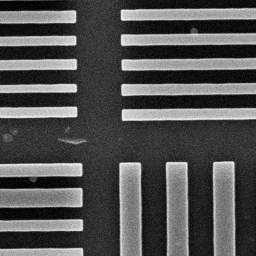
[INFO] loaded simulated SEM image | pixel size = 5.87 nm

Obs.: groups of lines, slits or small figures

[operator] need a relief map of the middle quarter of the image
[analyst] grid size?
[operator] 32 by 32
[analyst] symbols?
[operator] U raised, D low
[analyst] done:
UUUDDDDDDDDDDDDUUUUUUUUUUUUUUUUU
DDDDDDDDDDDDDDDDDDDDDDDDDDDDDDDD
DDDDDDDDDDDDDDDDDDDDDDDDDDDDDDDD
DDDDDDDDDDDDDDDDDDDDDDDDDDDDDDDD
DDDDDDDDDDDDDDDDDDDDDDDDDDDDDDDD
UUUDDDDDDDDDDDDUUUUUUUUUUUUUUUUU
UUUDDDDDDDDDDDUUUUUUUUUUUUUUUUUU
DDDDDDDDDDDDDDDUUUUUUUUUUUUUUUUU
DDDDDDDDDDDDDDDDDDDDDDDDDDDDDDDD
DDDDDDDDDDDDDDDDDDDDDDDDDDDDDDDD
DDDDDDDDDDDDDDDDDDDDDDDDDDDDDDDD
UUUDDDDDDDDDDDDUUUUUUUUUUUUUUUUU
UUUDDDDDDDDDDDDUUUUUUUUUUUUUUUUU
DDDDDDDDDDDDDDDUUUUUUUUUUUUUUUUU
DDDDDDDDDDDDDDDDDDDDDDDDDDDDDDDD
DDDDDDDDDDDDDDDDDDDDDDDDDDDDDDDD
DDDDDDDDDDDDDDDDDDDDDDDDDDDDDDDD
DDDDDDDDDDDDDDDDDDDDDDDDDDDDDDDD
DDDDDDDDDDDDDDDDDDDDDDDDDDDDDDDD
DDDDDDDDDDDDDDDDDDDDDDDDDDDDDDDD
DDDDDDDDDDDDDDDDDDDDDDDDDDDDDDDD
DDDDDDDDDDDDDDDDDDDDDDDDDDDDDDDD
DDDDDDDDDDDDDDDDDDDDDDDDDDDDDDDD
DDDDDDDDDDDDDDDDDDDDDDDDDDDDDDDD
DDDDDDDDDDDDDDDDDDDDDDDDDDDDDDDD
UUUUDDDDDDDDDDUUUUUDDDDDDDUUUUUD
UUUUDDDDDDDDDDUUUUUDDDDDDDUUUUUD
UUUUDDDDDDDDDDUUUUUDDDDDDDUUUUUD
DDDDDDDDDDDDDDUUUUUDDDDDDDUUUUUD
DDDDDDDDDDDDDDUUUUUDDDDDDDUUUUUD
DDDDDDDDDDDDDDUUUUUDDDDDDDUUUUUD
UUUUDDDDDDDDDDUUUUUDDDDDDDUUUUUD